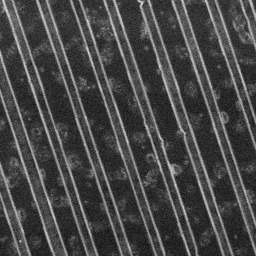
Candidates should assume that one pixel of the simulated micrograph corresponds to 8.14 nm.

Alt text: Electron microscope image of parallel lines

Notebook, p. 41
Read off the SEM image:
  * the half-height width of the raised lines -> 190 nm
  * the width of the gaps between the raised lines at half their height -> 68.5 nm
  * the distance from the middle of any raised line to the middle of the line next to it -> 261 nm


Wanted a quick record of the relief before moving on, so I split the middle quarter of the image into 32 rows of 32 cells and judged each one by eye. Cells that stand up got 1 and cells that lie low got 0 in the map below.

01111110001111110011111100011111
00111111001111110011111100011111
00111111001111110001111110011111
00111111000111111001111110001111
00011111100111111001111110001111
10011111100111111000111111001111
10011111100011111000111111000111
10001111110011111100111111000111
11001111110011111100011111100111
11001111110001111110011111100111
11001111111001111110011111100011
11100111111001111110001111110011
11100111111000111111001111110011
11100111111100111111001111110001
11100011111100111111000111111001
11110011111100011111100111111001
11110011111110011111100111111000
11111001111110011111100011111100
11111001111110001111110011111100
11111001111110001111110001111100
11111100111111001111110001111110
11111100111111000111111001111110
11111100111111000111111001111110
11111110011111100111111000111111
01111110011111100011111100111111
01111110011111100011111100111111
01111111001111110011111100011111
00111101001111110001111110011111
00111111001111111001111110011111
00111111100111111001111110001111
00111111100111111000111111001111
10011111100111111100111111001111